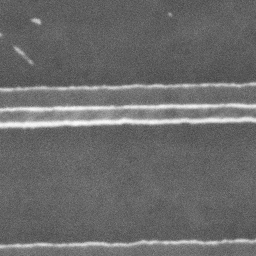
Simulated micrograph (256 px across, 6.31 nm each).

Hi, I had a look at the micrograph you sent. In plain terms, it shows lines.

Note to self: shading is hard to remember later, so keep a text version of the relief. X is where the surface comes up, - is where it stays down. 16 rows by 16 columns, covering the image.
----------------
----------------
----------------
----------------
----------------
--X--XXXXXXXXXXX
XXXXXXXXXXXXXXXX
XXXXXXXXXXXXX---
----------------
----------------
----------------
----------------
----------------
----------------
----------------
XXXXXXXXXXXXXXXX